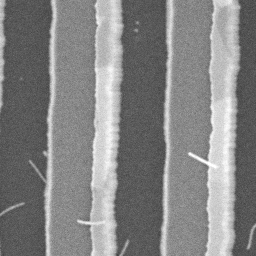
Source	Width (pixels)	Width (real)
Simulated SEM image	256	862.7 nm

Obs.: lines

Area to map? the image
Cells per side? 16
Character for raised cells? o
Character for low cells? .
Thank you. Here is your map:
...oooo....oooo.
...oooo....oooo.
...oooo....oooo.
...oooo....oooo.
...oooo....oooo.
...oooo...oooo..
...oooo...oooo..
...oooo...oooo..
...oooo...oooo..
...oooo...oooo..
...oooo...oooo..
...oooo...oooo..
...oooo...oooo..
...oooo...oooo..
...oooo...oooo..
...oooo...oooo..